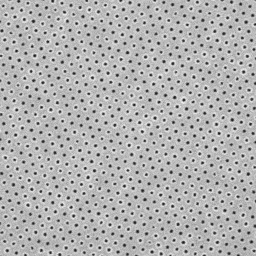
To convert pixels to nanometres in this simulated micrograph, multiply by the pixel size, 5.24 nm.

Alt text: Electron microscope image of a regular array of holes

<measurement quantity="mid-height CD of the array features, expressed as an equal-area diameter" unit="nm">16.7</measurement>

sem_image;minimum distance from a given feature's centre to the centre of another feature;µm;0.0474